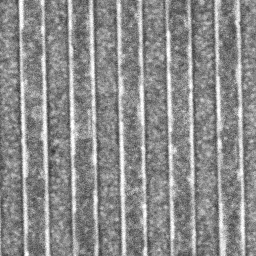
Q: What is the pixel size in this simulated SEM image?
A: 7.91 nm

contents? parallel lines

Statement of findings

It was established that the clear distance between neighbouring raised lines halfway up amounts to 197 nm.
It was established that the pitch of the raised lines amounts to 386 nm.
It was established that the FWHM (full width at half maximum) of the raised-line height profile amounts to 189 nm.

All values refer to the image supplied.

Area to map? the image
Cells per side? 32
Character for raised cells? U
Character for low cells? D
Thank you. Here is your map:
DDDUUDDDDUUDDDDUUUDDDUUUDDDUUUDD
DDDUUDDDDUUUDDDUUUDDDUUUDDDUUUDD
DDDUUDDDDUUUDDDUUUDDDUUUDDDUUUDD
DDDUUDDDDUUUDDDUUUDDDUUUDDDUUUDD
DDDUUDDDDUUUDDDUUUDDDUUUDDDUUUDD
DDDUUUDDDUUUDDDUUUDDDUUUDDDUUUDD
DDDUUUDDDUUUDDDUUUDDDUUUDDDUUUDD
DDDUUUDDDUUUDDDUUUDDDUUUDDDUUUDD
DDDUUUDDDUUUDDDUUUDDDUUUDDDUUUDD
DDDUUUDDDUUUDDDUUUDDDUUUDDDUUUDD
DDDUUUDDDUUUDDDUUUDDDUUUDDDUUUDD
DDDUUUDDDUUUDDDUUUDDDUUUDDDUUUDD
DDDUUUDDDUUUDDDUUUDDDUUUDDDUUUDD
DDDUUUDDDUUUDDDUUUDDDUUUDDDUUUDD
DDDUUUDDDUUUDDDUUUDDDUUUDDDUUUDD
DDDUUUDDDUUUDDDUUUDDDUUUDDDUUUDD
DDDUUUDDDUUUDDDUUUDDDUUUDDDUUUDD
DDDUUUDDDUUUDDDUUUDDDUUUDDDUUUDD
DDDUUUDDDUUUDDDUUUDDDUUUDDDUUUDD
DDDUUUDDDUUUDDDUUUDDDUUUDDDUUUDD
DDDUUUDDDUUUDDDUUUDDDUUUDDDUUUDD
DDDUUUDDDUUUDDDUUUDDDUUUDDDUUUDD
DDDUUUDDDUUUDDDUUUDDDUUUDDDUUUDD
DDDUUUDDDUUUDDDUUUDDDUUUDDDUUUDD
DDDUUUDDDUUUDDDUUUDDDUUUDDDUUUDD
DDDUUUDDDUUUDDDUUUDDDUUUDDDUUUDD
DDDUUUDDDUUUDDDUUUDDDUUUDDDUUUDD
DDDUUUDDDUUUDDDUUUDDDUUUDDDUUUDD
DDDUUUDDDUUUDDDUUUDDDUUUDDDDUUDD
DDDUUUDDDUUUDDDUUUDDDUUUDDDDUUDD
DDDUUUDDDUUUDDDUUUDDDUUUDDDDUUDD
DDDUUUDDDUUUDDDUUUDDDUUUDDDDUUDD